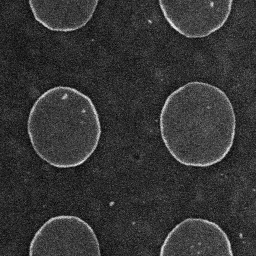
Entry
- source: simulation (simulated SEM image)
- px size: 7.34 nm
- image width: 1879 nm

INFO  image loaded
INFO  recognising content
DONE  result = raised bodies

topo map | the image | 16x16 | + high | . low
..++++....++++..
...++......+++..
................
................
................
...+.......+++..
..++++....++++..
..++++....+++++.
..++++....+++++.
..++++.....+++..
................
................
................
................
..++++.....+++..
..++++....++++..